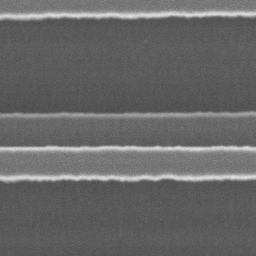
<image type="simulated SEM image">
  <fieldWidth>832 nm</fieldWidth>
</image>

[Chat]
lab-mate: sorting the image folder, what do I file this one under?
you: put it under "lines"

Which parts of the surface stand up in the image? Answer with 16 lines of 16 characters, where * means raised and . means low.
****************
................
................
................
................
................
................
****************
****************
****************
****************
................
................
................
................
................